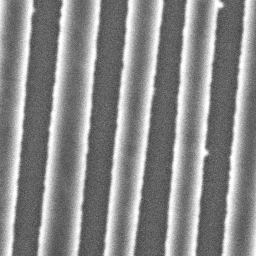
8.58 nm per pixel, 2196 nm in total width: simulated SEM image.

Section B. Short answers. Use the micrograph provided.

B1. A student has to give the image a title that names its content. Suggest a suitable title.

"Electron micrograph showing lines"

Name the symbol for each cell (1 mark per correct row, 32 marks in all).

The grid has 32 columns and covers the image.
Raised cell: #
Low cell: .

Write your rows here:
####....####....####...####....#
####....####....####...####....#
####....####....####...####....#
####....####....####...####....#
####....####....####...####...##
###....#####....####...####...##
###....#####....####...####...##
###....#####....###....####...##
###....#####...####....###....##
###....#####...####....###....##
###....#####...####....###....##
###....####....####...####....##
###....####....####...####....##
###....####....####...####....##
###....####....####...####...###
###...#####....###....####...###
###...#####....###....####...###
###...#####....###....####...###
##....#####...####....###....###
##....#####...####....###....###
##....#####...####....###....###
##....#####...####....###....###
##....####....####....###....###
##....####....####....###....###
##....####....###....####....###
##...#####....###....####....###
##...#####....###....####....###
##...#####....###....####...####
##...#####....###....####...####
##...#####...####....####...####
#....#####...####....###....####
#....#####...####....###....####